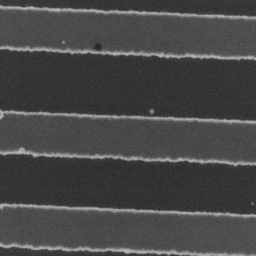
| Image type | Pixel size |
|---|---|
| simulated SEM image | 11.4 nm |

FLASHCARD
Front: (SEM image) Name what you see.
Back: lines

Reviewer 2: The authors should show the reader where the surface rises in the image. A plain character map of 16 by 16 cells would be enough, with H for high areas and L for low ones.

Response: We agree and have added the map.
HHLLLLLLLLLLLLLL
HHHHHHHHHHHHHHHH
HHHHHHHHHHHHHHHH
LLLLLLLLLLHHHHHH
LLLLLLLLLLLLLLLL
LLLLLLLLLLLLLLLL
LLLLLLLLLLLLLLLL
HHHHHHHHHHHHHHLL
HHHHHHHHHHHHHHHH
HHHHHHHHHHHHHHHH
LLLLLLLLLLLLLLLL
LLLLLLLLLLLLLLLL
LLLLLLLLLLLLLLLL
HHHHHHHHHHHHHHHH
HHHHHHHHHHHHHHHH
LLHHHHHHHHHHHHHH